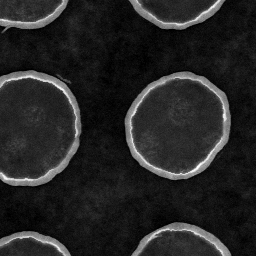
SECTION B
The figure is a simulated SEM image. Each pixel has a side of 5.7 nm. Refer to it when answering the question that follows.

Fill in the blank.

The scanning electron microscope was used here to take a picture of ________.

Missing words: raised bodies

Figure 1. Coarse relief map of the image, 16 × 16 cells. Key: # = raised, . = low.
####.....####...
.##.......##....
................
................
................
####.....####...
#####...######..
#####...######..
#####...######..
#####...#####...
####.....####...
................
................
................
..........###...
####.....#####..